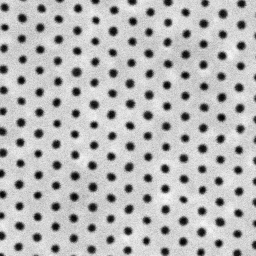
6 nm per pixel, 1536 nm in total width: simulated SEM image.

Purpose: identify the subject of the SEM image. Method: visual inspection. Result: a regular array of holes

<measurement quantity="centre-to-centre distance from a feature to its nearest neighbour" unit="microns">0.122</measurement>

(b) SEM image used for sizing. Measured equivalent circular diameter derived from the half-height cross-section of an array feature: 53.3 nanometres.